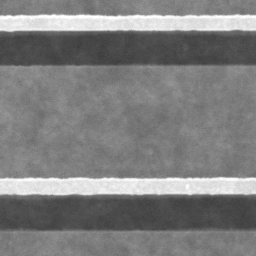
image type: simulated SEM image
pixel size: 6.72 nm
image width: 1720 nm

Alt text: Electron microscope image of lines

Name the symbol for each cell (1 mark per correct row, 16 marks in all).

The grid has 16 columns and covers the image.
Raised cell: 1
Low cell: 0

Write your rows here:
1111111111111111
1111111111111111
0000000000000000
0000000000000000
1111111111111111
1111111111111111
1111111111111111
1111111111111111
1111111111111111
1111111111111111
1111111111111111
1111111111111111
0000000000000000
0000000000000000
1111111111111111
1111111111111111